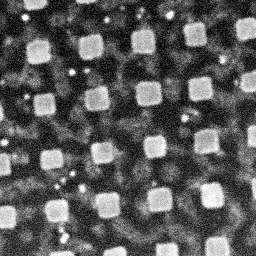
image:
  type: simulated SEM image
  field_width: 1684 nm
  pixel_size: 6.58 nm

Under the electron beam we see a regular array of raised bodies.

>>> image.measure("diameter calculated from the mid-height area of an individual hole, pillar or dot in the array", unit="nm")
153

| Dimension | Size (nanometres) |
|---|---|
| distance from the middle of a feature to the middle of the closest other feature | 341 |